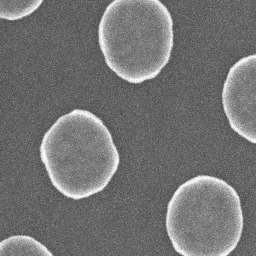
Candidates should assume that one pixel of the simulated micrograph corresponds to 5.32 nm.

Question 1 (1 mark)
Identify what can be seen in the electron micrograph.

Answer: raised bodies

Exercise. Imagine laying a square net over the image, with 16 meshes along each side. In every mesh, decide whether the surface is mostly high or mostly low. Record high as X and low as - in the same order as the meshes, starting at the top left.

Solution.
XX-----XXX------
------XXXXX-----
------XXXXX-----
-------XXXX-----
-------XXX----XX
--------------XX
--------------XX
----XX--------XX
---XXXX--------X
---XXXX---------
---XXXX---------
---XXXX-----XX--
-----------XXXX-
----------XXXXX-
-----------XXXX-
XXX--------XXXX-